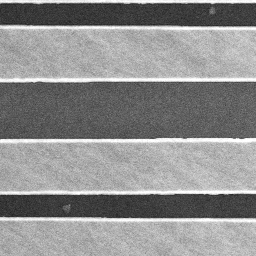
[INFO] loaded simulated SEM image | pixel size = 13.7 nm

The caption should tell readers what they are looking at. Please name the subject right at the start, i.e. lines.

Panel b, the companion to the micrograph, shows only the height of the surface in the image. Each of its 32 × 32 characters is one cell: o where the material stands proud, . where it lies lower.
................................
................................
................................
oooooooooooooooooooooooooooooooo
oooooooooooooooooooooooooooooooo
oooooooooooooooooooooooooooooooo
oooooooooooooooooooooooooooooooo
oooooooooooooooooooooooooooooooo
oooooooooooooooooooooooooooooooo
oooooooooooooooooooooooooooooooo
................................
................................
................................
................................
................................
................................
................................
......oooooooo.ooooooooooooooooo
oooooooooooooooooooooooooooooooo
oooooooooooooooooooooooooooooooo
oooooooooooooooooooooooooooooooo
oooooooooooooooooooooooooooooooo
oooooooooooooooooooooooooooooooo
oooooooooooooooooooooooooooooooo
................................
................................
................................
oooooooooooooooooooooooooooooooo
oooooooooooooooooooooooooooooooo
oooooooooooooooooooooooooooooooo
oooooooooooooooooooooooooooooooo
oooooooooooooooooooooooooooooooo